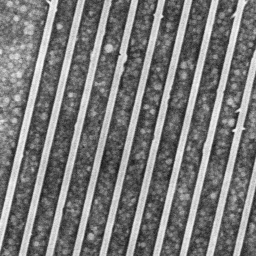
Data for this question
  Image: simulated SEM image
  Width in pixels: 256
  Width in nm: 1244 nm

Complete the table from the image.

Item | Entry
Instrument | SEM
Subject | parallel lines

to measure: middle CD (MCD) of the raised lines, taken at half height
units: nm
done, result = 30.8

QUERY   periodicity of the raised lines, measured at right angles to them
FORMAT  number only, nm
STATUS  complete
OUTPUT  127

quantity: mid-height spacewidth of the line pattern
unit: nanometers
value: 96.4